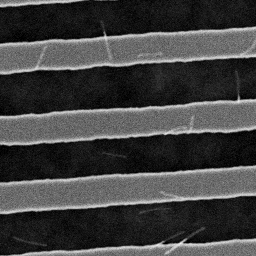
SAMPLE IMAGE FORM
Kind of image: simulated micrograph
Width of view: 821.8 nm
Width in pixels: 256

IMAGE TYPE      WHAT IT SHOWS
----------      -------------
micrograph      lines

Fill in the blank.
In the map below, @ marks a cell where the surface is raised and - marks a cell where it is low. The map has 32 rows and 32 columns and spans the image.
@@@@@---------------------------
--------------------------------
--------------------------------
------------------------------@@
-------------@-@@@@@@@@@@@@@@@@@
@@@@@@@@@@@@@@@@@@@@@@@@@@@@@@@@
@@@@@@@@@@@@@@@@@@@@@@@@@@@@@@@@
@@@@@@@@@@@@@@@@@@@@@@@@@@------
@@@@@@@@@@@---------------------
--------------------------------
--------------------------------
--------------------------------
-----------------------------@@@
----------------@@@@@@@@@@@@@@@@
--@@@@@@@@@@@@@@@@@@@@@@@@@@@@@@
@@@@@@@@@@@@@@@@@@@@@@@@@@@@@@@@
@@@@@@@@@@@@@@@@@@@@@@@@@@@@@---
@@@@@@@@@@@@--------------------
--------------------------------
--------------------------------
--------------------------------
----------------------@@@@@@@@@@
-----@@@@@@@@@@@@@@@@@@@@@@@@@@@
@@@@@@@@@@@@@@@@@@@@@@@@@@@@@@@@
@@@@@@@@@@@@@@@@@@@@@@@@@@@@@@--
@@@@@@@@@@@@@@@@@@--------------
@@------------------------------
--------------------------------
--------------------------------
--------------------------------
--------------------@@@@@@@@@@@@
-----@@@@@@@@@@@@@@@@@@@@@@@@@@@